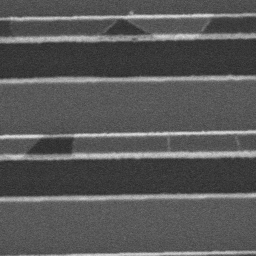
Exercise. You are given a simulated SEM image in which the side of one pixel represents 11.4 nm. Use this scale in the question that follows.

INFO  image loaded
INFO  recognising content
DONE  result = lines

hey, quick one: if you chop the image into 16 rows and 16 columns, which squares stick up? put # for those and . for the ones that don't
################
################
###.............
................
................
################
################
################
################
################
................
................
.###############
################
################
################